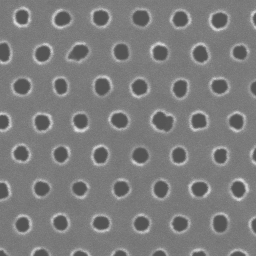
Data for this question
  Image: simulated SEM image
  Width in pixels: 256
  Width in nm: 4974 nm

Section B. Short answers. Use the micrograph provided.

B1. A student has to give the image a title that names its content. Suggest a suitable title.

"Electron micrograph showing a regular array of holes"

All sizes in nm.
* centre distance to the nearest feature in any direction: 740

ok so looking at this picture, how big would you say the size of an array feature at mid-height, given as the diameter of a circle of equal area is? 313 nm